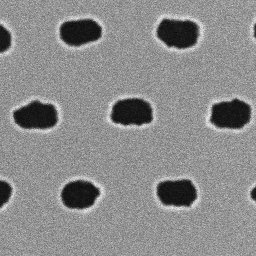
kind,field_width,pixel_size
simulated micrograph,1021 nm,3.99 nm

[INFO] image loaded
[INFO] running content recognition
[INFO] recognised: holes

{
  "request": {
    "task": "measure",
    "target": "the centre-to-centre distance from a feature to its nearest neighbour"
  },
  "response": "365 nm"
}